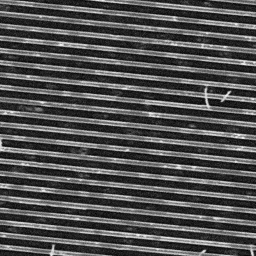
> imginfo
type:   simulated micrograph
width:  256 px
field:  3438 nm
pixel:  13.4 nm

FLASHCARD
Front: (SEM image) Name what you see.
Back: parallel lines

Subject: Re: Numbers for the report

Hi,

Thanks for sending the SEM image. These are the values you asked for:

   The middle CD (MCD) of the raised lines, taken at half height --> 56.7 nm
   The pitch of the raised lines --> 164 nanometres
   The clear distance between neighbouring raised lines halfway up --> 114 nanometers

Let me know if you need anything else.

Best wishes